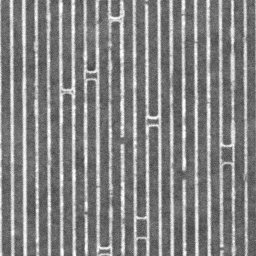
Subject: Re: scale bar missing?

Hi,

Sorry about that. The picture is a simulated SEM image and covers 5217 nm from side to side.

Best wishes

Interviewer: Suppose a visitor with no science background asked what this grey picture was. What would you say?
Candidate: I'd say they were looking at parallel lines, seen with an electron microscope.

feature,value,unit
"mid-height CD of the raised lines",35.7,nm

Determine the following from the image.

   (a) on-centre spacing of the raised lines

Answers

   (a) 12.3 px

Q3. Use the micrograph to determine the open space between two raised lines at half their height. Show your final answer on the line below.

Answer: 216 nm